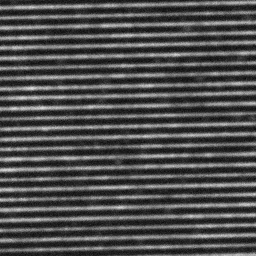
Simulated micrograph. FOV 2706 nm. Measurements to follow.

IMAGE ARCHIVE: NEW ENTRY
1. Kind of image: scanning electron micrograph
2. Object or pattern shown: parallel lines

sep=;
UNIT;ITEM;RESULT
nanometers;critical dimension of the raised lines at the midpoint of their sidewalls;27.7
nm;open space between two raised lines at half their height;83.2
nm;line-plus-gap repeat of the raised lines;107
